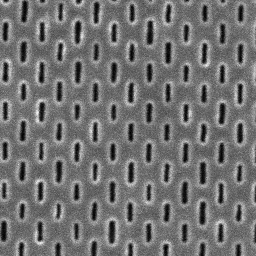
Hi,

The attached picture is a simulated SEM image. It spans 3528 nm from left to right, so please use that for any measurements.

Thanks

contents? a regular array of holes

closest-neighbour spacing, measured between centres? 0.366 microns